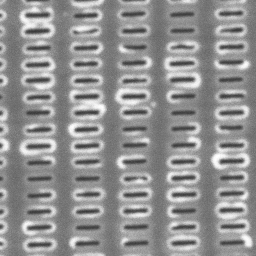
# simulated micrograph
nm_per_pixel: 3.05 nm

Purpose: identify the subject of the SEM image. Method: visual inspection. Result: a regular array of holes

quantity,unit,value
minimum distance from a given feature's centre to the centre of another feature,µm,0.0487